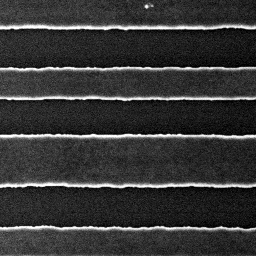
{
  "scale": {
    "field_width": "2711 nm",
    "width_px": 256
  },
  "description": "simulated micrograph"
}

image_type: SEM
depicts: lines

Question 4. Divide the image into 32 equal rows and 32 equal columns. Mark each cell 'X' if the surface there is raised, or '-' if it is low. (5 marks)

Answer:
XXXXXXXXXXXXXXXXXXXXXXXXXXXXXXXX
XXXXXXXXXXXXXXXXXXXXXXXXXXXXXXXX
XXXXXXXXXXXXXXXXXXXXXXXXXXXXXXXX
XXX---XXXX-XXXXXXXXXXXXXXXX----X
--------------------------------
--------------------------------
--------------------------------
--------------------------------
-X---XXXXXXX--XXXXX-XXXXXXXX-XXX
XXXXXXXXXXXXXXXXXXXXXXXXXXXXXXXX
XXXXXXXXXXXXXXXXXXXXXXXXXXXXXXXX
XXXXXXXXXXXXXXXXXXXXXXXXXXXXXXXX
---------------X----------------
--------------------------------
--------------------------------
--------------------------------
--------------------------------
XXXXXXXXXXXXXXXXXXXXXXXXXXXXXXXX
XXXXXXXXXXXXXXXXXXXXXXXXXXXXXXXX
XXXXXXXXXXXXXXXXXXXXXXXXXXXXXXXX
XXXXXXXXXXXXXXXXXXXXXXXXXXXXXXXX
XXXXXXXXXXXXXXXXXXXXXXXXXXXXXXXX
XXXXXXXXXXXXXXXXXXXXXXXXXXXXXXXX
--------------------------------
--------------------------------
--------------------------------
--------------------------------
--------------------------------
XXXXXXXXXXXXXXXXXXXXXXXXXX-XXX--
XXXXXXXXXXXXXXXXXXXXXXXXXXXXXXXX
XXXXXXXXXXXXXXXXXXXXXXXXXXXXXXXX
XXXXXXXXXXXXXXXXXXXXXXXXXXXXXXXX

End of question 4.